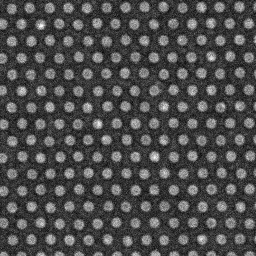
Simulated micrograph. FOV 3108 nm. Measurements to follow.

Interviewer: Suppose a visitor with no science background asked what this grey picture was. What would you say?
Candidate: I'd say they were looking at a regular array of raised bodies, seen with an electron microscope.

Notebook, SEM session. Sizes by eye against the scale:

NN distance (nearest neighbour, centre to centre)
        222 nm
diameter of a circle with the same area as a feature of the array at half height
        109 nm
